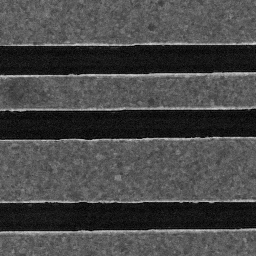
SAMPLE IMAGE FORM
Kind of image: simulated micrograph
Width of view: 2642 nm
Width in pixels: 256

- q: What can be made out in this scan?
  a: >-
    lines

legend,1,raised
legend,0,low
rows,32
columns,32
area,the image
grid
11111111111111111111111111111111
11111111111111111111111111111111
11111111111111111111111111111111
11111111111111111111111111111111
11111111111111111111111111111111
11111111111111111111110111111100
00000000000000000000000000000000
00000000000000000000000000000000
00000000000000000000000000000000
01111111111111111111111111111111
11111111111111111111111111111111
11111111111111111111111111111111
11111111111111111111111111111111
11111111111111111111111111111111
00000000000000000000000000000000
00000000000000000000000000000000
00000000000000000000000000000000
00000000110011011111111111111111
11111111111111111111111111111111
11111111111111111111111111111111
11111111111111111111111111111111
11111111111111111111111111111111
11111111111111111111111111111111
11111111111111111111111111111111
11111111111111111111111111111111
00000000000000000000000000000000
00000000000000000000000000000000
00000000000000000000000000000000
00000000000000000000000000000000
11111111111111111111111111111111
11111111111111111111111111111111
11111111111111111111111111111111